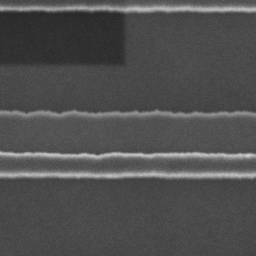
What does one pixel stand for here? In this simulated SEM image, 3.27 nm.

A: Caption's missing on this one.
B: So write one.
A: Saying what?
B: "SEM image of lines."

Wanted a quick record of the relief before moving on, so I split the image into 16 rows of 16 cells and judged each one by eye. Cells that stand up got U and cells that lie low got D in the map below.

UUUUUUUUUUUUUUUU
DDDDDDDDDDDDDDDD
DDDDDDDDDDDDDDDD
DDDDDDDDDDDDDDDD
DDDDDDDDDDDDDDDD
DDDDDDDDDDDDDDDD
DDDDDDDDDDDDDDDD
UUUUUUUUUUUUUUUU
UUUUUUUUUUUUUUUU
UUUUUUUUUUUUUUUU
UUUUUUUUUUUUUUUU
DDDDDDDDDDDDDDDD
DDDDDDDDDDDDDDDD
DDDDDDDDDDDDDDDD
DDDDDDDDDDDDDDDD
DDDDDDDDDDDDDDDD